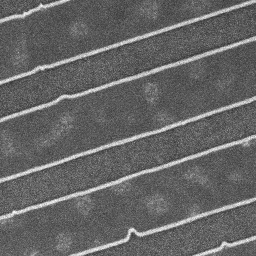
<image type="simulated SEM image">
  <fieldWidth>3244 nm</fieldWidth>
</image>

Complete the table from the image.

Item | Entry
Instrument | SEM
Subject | one or a few lines or trenches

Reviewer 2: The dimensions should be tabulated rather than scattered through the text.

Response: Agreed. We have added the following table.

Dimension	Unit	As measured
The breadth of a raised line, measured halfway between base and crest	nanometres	732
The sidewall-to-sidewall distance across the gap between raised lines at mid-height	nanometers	454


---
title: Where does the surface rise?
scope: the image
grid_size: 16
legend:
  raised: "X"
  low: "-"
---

--XXXXXXXXXXXXX-
XXXXXXXXXXX-----
XXXXXXXX--------
XXXXX--------XXX
XX-------XXXXXXX
------XXXXXXXXXX
---XXXXXXXXXXXX-
XXXXXXXXXXXX----
XXXXXXXXX-------
XXXXXX-------XXX
XXX-------XXXXXX
-------XXXXXXXXX
----XXXXXXXXXXXX
XXXXXXXXXXXX----
XXXXXXXXX-------
XXXXXX--------XX